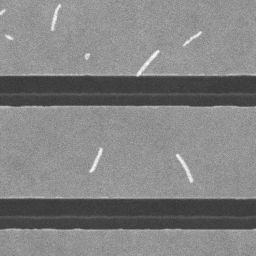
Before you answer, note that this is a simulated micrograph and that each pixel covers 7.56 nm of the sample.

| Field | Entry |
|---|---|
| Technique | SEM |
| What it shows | lines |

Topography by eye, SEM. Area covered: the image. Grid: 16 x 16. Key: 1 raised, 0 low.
1111111111111111
1111111111111111
1111111111111111
1111111111111111
1111111111111111
0000000000000000
0000000000000000
1111111111111111
1111111111111111
1111111111111111
1111111111111111
1111111111111111
0000000000000000
0000000000000000
1111111111111111
1111111111111111